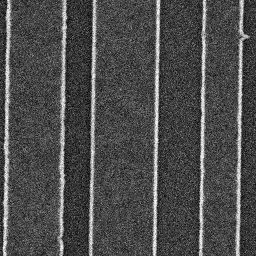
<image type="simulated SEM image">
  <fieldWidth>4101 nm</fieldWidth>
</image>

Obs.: one or a few lines or trenches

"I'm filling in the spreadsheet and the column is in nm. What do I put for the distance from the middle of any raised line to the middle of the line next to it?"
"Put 1490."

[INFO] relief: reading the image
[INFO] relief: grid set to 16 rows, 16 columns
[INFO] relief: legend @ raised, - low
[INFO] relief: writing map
-@@@--@@@@---@@-
-@@@--@@@@---@@-
-@@@--@@@@---@@-
@@@@--@@@@---@@-
@@@@--@@@@---@@-
@@@@--@@@@---@@-
@@@@--@@@@---@@-
@@@@--@@@@---@@-
@@@@--@@@@---@@-
@@@@--@@@@---@@-
@@@@--@@@@---@@-
@@@@--@@@@---@@-
@@@@--@@@@---@@-
@@@@--@@@@---@@-
@@@@--@@@@---@@-
@@@@--@@@@---@@-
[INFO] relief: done